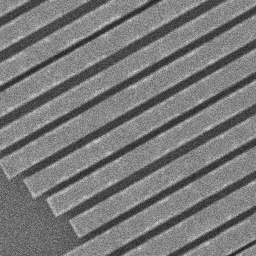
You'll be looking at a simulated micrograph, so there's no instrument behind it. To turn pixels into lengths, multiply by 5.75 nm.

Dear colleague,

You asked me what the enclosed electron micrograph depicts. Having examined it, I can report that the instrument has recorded parallel lines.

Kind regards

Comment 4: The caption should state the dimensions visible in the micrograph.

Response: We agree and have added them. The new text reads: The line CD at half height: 113 nm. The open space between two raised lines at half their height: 0.0493 microns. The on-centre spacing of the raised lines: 0.164 micrometres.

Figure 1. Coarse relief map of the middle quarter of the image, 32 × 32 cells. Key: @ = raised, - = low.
@@@@@@@-----@@@@@@@@@----@@@@@@@
@@@@@------@@@@@@@@@----@@@@@@@@
@@@------@@@@@@@@@----@@@@@@@@@@
@------@@@@@@@@@----@@@@@@@@@@@-
-----@@@@@@@@@----@@@@@@@@@@@---
---@@@@@@@@@@----@@@@@@@@@@-----
-@@@@@@@@@@----@@@@@@@@@@-----@@
@@@@@@@@@----@@@@@@@@@@-----@@@@
@@@@@@@----@@@@@@@@@@@-----@@@@@
@@@@@-----@@@@@@@@@@-----@@@@@@@
@@@@----@@@@@@@@@@-----@@@@@@@@@
@@----@@@@@@@@@@-----@@@@@@@@@@-
----@@@@@@@@@@@----@@@@@@@@@@---
---@@@@@@@@@@-----@@@@@@@@@-----
-@@@@@@@@@@-----@@@@@@@@@@----@@
@@@@@@@@@-----@@@@@@@@@@----@@@@
@@@@@@@-----@@@@@@@@@@----@@@@@@
@@@@@@-----@@@@@@@@@----@@@@@@@@
@@@@-----@@@@@@@@@@----@@@@@@@@@
@@-----@@@@@@@@@@----@@@@@@@@@@-
-----@@@@@@@@@@----@@@@@@@@@@---
----@@@@@@@@@----@@@@@@@@@@-----
--@@@@@@@@@@----@@@@@@@@@------@
@@@@@@@@@@----@@@@@@@@@@-----@@@
@@@@@@@@----@@@@@@@@@@-----@@@@@
@@@@@@----@@@@@@@@@@------@@@@@@
@@@@@----@@@@@@@@@------@@@@@@@@
@@@----@@@@@@@@@@-----@@@@@@@@@@
@----@@@@@@@@@@-----@@@@@@@@@@--
---@@@@@@@@@@------@@@@@@@@@----
--@@@@@@@@@------@@@@@@@@@@----@
@@@@@@@@@@-----@@@@@@@@@-----@@@